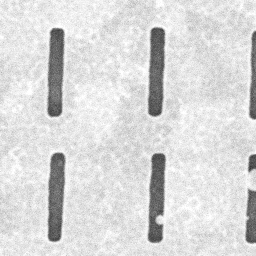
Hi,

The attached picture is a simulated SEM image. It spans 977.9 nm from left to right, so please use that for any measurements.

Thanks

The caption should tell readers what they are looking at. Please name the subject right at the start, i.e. holes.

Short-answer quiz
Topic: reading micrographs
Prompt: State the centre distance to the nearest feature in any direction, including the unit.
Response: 386 nanometres